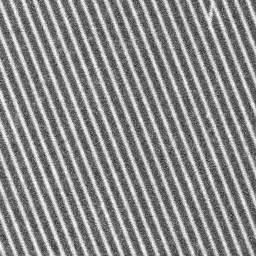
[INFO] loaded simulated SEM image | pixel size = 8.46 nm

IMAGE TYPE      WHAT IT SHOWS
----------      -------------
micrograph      parallel lines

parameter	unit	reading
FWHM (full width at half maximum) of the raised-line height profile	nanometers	15.7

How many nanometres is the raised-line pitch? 93.3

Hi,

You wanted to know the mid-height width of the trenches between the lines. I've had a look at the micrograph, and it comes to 79.8 nm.